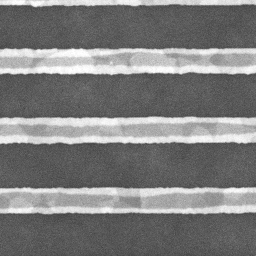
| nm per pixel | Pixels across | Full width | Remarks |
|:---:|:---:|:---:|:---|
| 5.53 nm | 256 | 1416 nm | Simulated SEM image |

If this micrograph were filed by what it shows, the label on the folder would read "lines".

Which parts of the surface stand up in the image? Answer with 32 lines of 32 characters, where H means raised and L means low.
LLLLHHLLLLLLLLLLLLLLLLLLLLLLLLLL
LLLLLLLLLLLLLLLLLLLLLLLLLLLLLLLL
LLLLLLLLLLLLLLLLLLLLLLLLLLLLLLLL
LLLLLLLLLLLLLLLLLLLLLLLLLLLLLLLL
LLLLLLLLLLLLLLLLLLLLLLLLLLLLLLLL
LLLLLLLLLLLLLLLLLLLLLLLLLLLLLLLL
HHHHHLHHHHHHHHHHHHHHHHHHHHHHHHHH
HHHHHHHHHHHHHHHHHHHHHHHHHHHHHHHH
HHHHHHHHHHHHHHHHHHHHHHHHHHHHHHHH
LLLLLLLLLLLLLLLLLLLLLLLLLLLLLLLL
LLLLLLLLLLLLLLLLLLLLLLLLLLLLLLLL
LLLLLLLLLLLLLLLLLLLLLLLLLLLLLLLL
LLLLLLLLLLLLLLLLLLLLLLLLLLLLLLLL
LLLLLLLLLLLLLLLLLLLLLLLLLLLLLLLL
LLLLLLLLLLLLLLLLLLLLLLLLLLLLLLLL
HHHHHHHHHHHHHHHHHHHHHHHHHHHHHHHH
HHHHHHHHHHHHHHHHHHHHHHHHHHHHHHHH
HHHHHHHHHHHHHHHHHHHHHHHHHHHHHHHL
LLLLLLLLLLLLLLLLLLLLLLLLLLLLLLLL
LLLLLLLLLLLLLLLLLLLLLLLLLLLLLLLL
LLLLLLLLLLLLLLLLLLLLLLLLLLLLLLLL
LLLLLLLLLLLLLLLLLLLLLLLLLLLLLLLL
LLLLLLLLLLLLLLLLLLLLLLLLLLLLLLLL
LLLLLLLLLLLLLLLLLLLLLLLLLLLLLLLL
HHHHHHHHHHHHHHHHHHHHHHHHHHHHHHHH
HHHHHHHHHHHHHHHHHHHHHHHHHHHHHHHH
LLLLLLLLLLLLLLLLLLLLLLLLLLLLLLLL
LLLLLLLLLLLLLLLLLLLLLLLLLLLLLLLL
LLLLLLLLLLLLLLLLLLLLLLLLLLLLLLLL
LLLLLLLLLLLLLLLLLLLLLLLLLLLLLLLL
LLLLLLLLLLLLLLLLLLLLLLLLLLLLLLLL
LLLLLLLLLLLLLLLLLLLLLLLLLLLLLLLL